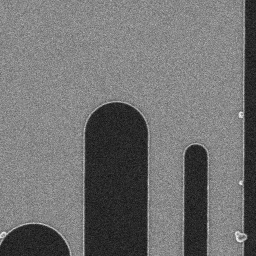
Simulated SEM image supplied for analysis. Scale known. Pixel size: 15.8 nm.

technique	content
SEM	groups of lines, slits or small figures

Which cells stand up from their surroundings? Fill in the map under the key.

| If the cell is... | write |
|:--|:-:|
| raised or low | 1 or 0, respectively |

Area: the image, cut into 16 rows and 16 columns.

0000000000000001
0000000000000001
0000000000000001
0000000000000001
0000000000000001
0000000000000001
0000000100000001
0000011110000001
0000011110000001
0000011110001001
0000011110011001
0000011110011001
0000011110011001
0000011110011001
1111011110011001
1111011110011001